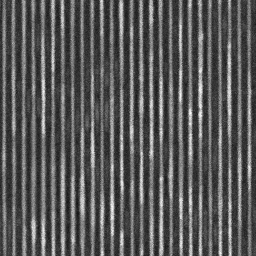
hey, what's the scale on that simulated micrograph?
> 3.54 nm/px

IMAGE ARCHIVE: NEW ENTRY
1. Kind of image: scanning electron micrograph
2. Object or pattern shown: parallel lines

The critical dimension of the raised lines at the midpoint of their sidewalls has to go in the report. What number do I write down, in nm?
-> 8.9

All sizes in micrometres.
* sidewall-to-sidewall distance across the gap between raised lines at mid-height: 0.0248